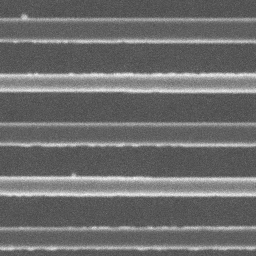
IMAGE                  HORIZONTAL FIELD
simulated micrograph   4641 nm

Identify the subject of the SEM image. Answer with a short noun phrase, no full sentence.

lines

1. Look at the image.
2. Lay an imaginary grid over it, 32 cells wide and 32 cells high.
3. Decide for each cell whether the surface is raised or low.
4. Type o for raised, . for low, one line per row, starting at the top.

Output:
................................
................................
oooooooooooooooooooooooooooooooo
oooooooooooooooooooooooooooooooo
oooooooooooooooooooooooooooooooo
................................
................................
................................
................................
oooooooooooooooooooooooooooooooo
oooooooooooooooooooooooooooooooo
................................
................................
................................
................................
oooooooooooooooooooooooooooooooo
oooooooooooooooooooooooooooooooo
oooooooooooooooooooooooooooooooo
................................
................................
................................
................................
oooooooooooooooooooooooooooooooo
oooooooooooooooooooooooooooooooo
................................
................................
................................
................................
...........ooo.o..o.oo.ooooooooo
oooooooooooooooooooooooooooooooo
oooooooooooooooooooooooooooooooo
................................